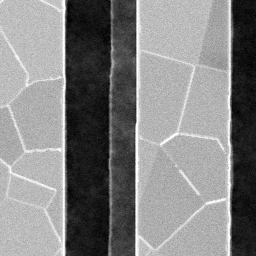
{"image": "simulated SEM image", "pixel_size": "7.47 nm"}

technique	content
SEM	lines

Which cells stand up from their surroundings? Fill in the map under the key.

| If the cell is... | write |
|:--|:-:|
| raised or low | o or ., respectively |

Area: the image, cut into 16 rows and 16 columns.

oooo...ooooooo..
oooo...ooooooo..
oooo...ooooooo..
oooo...ooooooo..
oooo...ooooooo..
oooo...ooooooo..
oooo...ooooooo..
oooo...ooooooo..
oooo...ooooooo..
oooo...ooooooo..
oooo...ooooooo..
oooo...ooooooo..
oooo...ooooooo..
oooo...ooooooo..
oooo...ooooooo..
oooo...ooooooo..